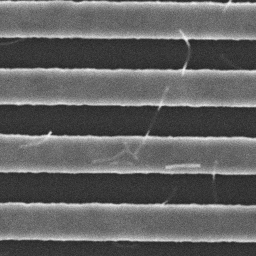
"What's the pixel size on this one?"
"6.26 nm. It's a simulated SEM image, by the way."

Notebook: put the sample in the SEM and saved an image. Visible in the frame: lines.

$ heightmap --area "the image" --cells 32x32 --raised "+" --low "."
++++++++++++++++++++++++++++++++
++++++++++++++++++++++++++++++++
++++++++++++++++++++++++++++++++
++++++++++++++++++++++++++++++++
++++++++++++++++++++++++++++++++
................................
................................
................................
................................
++++++++++++++++++++++++++++++++
++++++++++++++++++++++++++++++++
++++++++++++++++++++++++++++++++
++++++++++++++++++++++++++++++++
................................
................................
................................
................................
++++++++++++++++++++++++++++++++
++++++++++++++++++++++++++++++++
++++++++++++++++++++++++++++++++
++++++++++++++++++++++++++++++++
+..++.++++++++++++++++++++++++++
................................
................................
................................
++++++++++++++.+...++...........
++++++++++++++++++++++++++++++++
++++++++++++++++++++++++++++++++
++++++++++++++++++++++++++++++++
++++++++++++++++++++++++++++++++
................................
................................